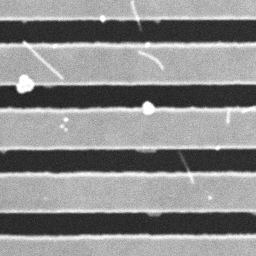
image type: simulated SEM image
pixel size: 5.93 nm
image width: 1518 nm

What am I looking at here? lines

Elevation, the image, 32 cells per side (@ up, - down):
@@@@@@@@@@@@@@@@@@@@@@@@@@@@@@@@
@@@@@@@@@@@@@@@@@@@@@@@@@@@@@@@@
@@@@@@@@@@-@@@@@@@--------------
--------------------------------
--------------------------------
-@@@@@-@@@@@@@@@@@@@@@@@@@@@@@@@
@@@@@@@@@@@@@@@@@@@@@@@@@@@@@@@@
@@@@@@@@@@@@@@@@@@@@@@@@@@@@@@@@
@@@@@@@@@@@@@@@@@@@@@@@@@@@@@@@@
@@@@@@@@@@@@@@@@@@@@@@@@@@@@@@@@
@@@@@@@@@@@@@@@@@@@@@@@---@-----
--------------------------------
--------------------------------
--------------@--@@@----@---@@-@
@@@@@@@@@@@@@@@@@@@@@@@@@@@@@@@@
@@@@@@@@@@@@@@@@@@@@@@@@@@@@@@@@
@@@@@@@@@@@@@@@@@@@@@@@@@@@@@@@@
@@@@@@@@@@@@@@@@@@@@@@@@@@@@@@@@
@@@@@@@@@@@@@@@@@@@@@@@@@@@@@@@@
--------------------------------
--------------------------------
-----------@-----------@----@@--
@@@@@@@@@@@@@@@@@@@@@@@@@@@@@@@@
@@@@@@@@@@@@@@@@@@@@@@@@@@@@@@@@
@@@@@@@@@@@@@@@@@@@@@@@@@@@@@@@@
@@@@@@@@@@@@@@@@@@@@@@@@@@@@@@@@
@@@@@@@@@@@@@@@@@@@@@-@@@@------
--------------------------------
--------------------------------
@@@@-@@@-@@@@@@@@@@@@@@@@@@@@@@@
@@@@@@@@@@@@@@@@@@@@@@@@@@@@@@@@
@@@@@@@@@@@@@@@@@@@@@@@@@@@@@@@@